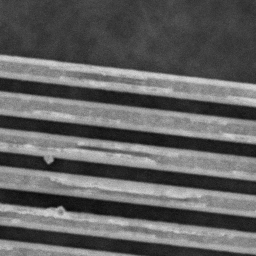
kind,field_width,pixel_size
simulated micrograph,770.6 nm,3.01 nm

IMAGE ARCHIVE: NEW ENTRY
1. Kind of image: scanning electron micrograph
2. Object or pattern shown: parallel lines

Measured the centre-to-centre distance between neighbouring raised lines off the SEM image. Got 0.111 micrometres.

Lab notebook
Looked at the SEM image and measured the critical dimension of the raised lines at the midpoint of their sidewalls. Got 0.0539 um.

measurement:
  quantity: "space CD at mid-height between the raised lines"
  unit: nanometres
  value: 56.1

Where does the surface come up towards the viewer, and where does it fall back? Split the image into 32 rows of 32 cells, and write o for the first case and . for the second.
................................
................................
................................
................................
................................
................................
................................
ooo.............................
oooooooooooo....................
..oooooooooooooooooo............
..........oooooooooooooooooo....
...................ooooooooooooo
ooooooo.....................oooo
ooooooooooooooo.................
....ooooooooooooooooooo.........
.............ooooooooooooooooooo
o.....................oooooooooo
oooooooooo....................oo
ooooooooooooooooooo.............
........ooooooooooooooooooo.....
................oooooooooooooooo
oooo.....................ooooooo
oooooooooooo....................
...oooooooooooooooooo...........
...........ooooooooooooooooooo..
....................oooooooooooo
oooooooo.....................ooo
ooooooooooooooo.................
......ooooooooooooooooo.........
...............ooooooooooooooooo
o.......................oooooooo
oooooooooo......................